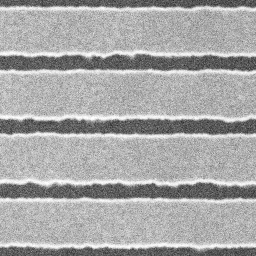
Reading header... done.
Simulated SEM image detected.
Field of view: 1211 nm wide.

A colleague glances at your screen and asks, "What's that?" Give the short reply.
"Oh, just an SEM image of lines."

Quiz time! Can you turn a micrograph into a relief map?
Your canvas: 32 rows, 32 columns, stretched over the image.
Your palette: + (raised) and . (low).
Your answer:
................................
++++++++++++++++++++++++++++++++
++++++++++++++++++++++++++++++++
++++++++++++++++++++++++++++++++
++++++++++++++++++++++++++++++++
++++++++++++++++++++++++++++++++
++++++++++++++++++++++++++++++++
................................
................................
++++++++++++++++++++++++++++++++
++++++++++++++++++++++++++++++++
++++++++++++++++++++++++++++++++
++++++++++++++++++++++++++++++++
++++++++++++++++++++++++++++++++
++++++++++++++++++++++++++++++++
................................
................................
++++++++++++++++++++++++++++++++
++++++++++++++++++++++++++++++++
++++++++++++++++++++++++++++++++
++++++++++++++++++++++++++++++++
++++++++++++++++++++++++++++++++
++++++++++++++++++++++++++++++++
................................
................................
++++++++++++++++++++++++++++++++
++++++++++++++++++++++++++++++++
++++++++++++++++++++++++++++++++
++++++++++++++++++++++++++++++++
++++++++++++++++++++++++++++++++
++++++++++++++++++++++++++++++++
................................